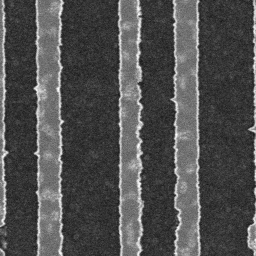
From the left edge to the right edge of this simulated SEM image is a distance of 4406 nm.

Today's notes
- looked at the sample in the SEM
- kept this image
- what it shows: one or a few lines or trenches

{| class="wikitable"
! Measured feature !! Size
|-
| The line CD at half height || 375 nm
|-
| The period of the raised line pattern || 1190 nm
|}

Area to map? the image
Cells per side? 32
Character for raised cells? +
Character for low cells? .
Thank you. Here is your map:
.....+++.......++.....+++.......
.....+++.......++.....+++.......
.....+++.......++.....+++.......
+....+++.......++.....+++.......
+....++........++.....+++.......
.....++........++.....+++.......
.....++........++.....+++.......
+....++........++.....+++.......
.....+++.......++.....+++.......
+....++........+++....+++.......
+....++........++.....+++.......
+....++........+++....+++.......
+....++........++.....+++.......
.....++........+++....+++.......
.....++........++.....+++.......
.....+++.......++.....+++.......
.....+++.......++.....+++.......
.....+++.......++.....+++.......
+....+++.......++.....+++.......
+....+++.......++.....+++.......
.....+++.......+++....+++.......
.....+++.......+++....+++.......
.....+++.......++.....+++.......
+....+++.......++.....+++.......
+....+++.......+++....+++.......
+....+++.......+++....+++.......
+....+++.......+++....+++.......
.....+++.......+++....+++.......
.....+++.......+++....+++......+
.....+++.......+++....+++......+
.....+++.......++.....+++......+
.....+++.......++.....+++.......